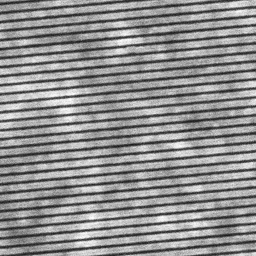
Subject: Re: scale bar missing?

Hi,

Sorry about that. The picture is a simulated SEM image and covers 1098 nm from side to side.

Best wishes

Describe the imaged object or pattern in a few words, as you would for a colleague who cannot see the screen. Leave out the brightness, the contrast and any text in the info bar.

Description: parallel lines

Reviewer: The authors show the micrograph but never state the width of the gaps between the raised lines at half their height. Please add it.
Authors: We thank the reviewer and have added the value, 15.5 nm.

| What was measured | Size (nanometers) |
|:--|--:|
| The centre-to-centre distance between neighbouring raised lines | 38.5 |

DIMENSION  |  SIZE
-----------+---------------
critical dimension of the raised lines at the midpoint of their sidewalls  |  0.0229 microns